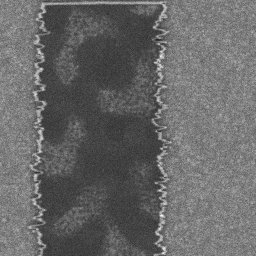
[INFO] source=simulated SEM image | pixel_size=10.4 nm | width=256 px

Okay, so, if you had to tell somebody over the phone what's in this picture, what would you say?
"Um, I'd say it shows one or a few lines or trenches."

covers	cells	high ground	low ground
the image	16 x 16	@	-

---@@@@@@@------
---@@@@@@@------
--@@@@@@@@------
--@@@@@@@@------
--@@@@@@@@------
--@@@@@@@@------
--@@@@@@@@------
--@@@@@@@@------
---@@@@@@@------
--@@@@@@@@------
--@@@@@@@@------
--@@@@@@@@------
--@@@@@@@@------
--@@@@@@@@------
--@@@@@@@@------
---@@@@@@@------